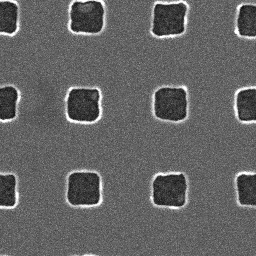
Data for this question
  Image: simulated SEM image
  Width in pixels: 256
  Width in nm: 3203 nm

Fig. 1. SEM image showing holes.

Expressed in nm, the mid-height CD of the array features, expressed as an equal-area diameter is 443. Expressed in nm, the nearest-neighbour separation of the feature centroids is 1070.